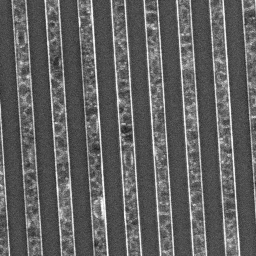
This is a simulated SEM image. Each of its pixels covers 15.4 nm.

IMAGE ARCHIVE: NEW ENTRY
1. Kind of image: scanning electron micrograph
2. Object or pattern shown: parallel lines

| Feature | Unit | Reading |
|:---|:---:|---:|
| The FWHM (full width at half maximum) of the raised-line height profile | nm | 212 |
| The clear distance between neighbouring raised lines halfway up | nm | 295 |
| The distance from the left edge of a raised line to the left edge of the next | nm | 506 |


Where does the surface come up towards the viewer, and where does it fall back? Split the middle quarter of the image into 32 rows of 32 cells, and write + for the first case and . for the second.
.....+++.....+++.....+++.....+++
.....+++.....+++.....++++....+++
.....+++.....+++.....++++....+++
.....+++.....+++.....++++....+++
.....+++.....++++....++++.....++
.....+++.....++++....++++.....++
.....+++.....++++....++++.....++
.....+++.....++++.....+++.....++
.....+++.....++++.....+++.....++
.....+++.....++++.....+++.....++
.....+++.....++++.....+++.....++
.....++++.....+++.....+++.....++
.....++++.....+++.....+++.....++
.....++++.....+++.....+++.....++
+.....+++.....+++.....+++.....++
+.....+++.....+++.....+++.....++
+.....+++.....+++.....+++.....++
+.....+++.....+++.....+++.....++
+.....+++.....+++.....+++.....++
+.....+++.....++++....++++....++
+.....+++.....++++....++++.....+
+.....+++.....++++....++++.....+
+.....+++.....++++....++++.....+
+.....+++.....++++.....+++.....+
+.....+++.....++++.....+++.....+
+.....+++.....++++.....+++.....+
+.....++++.....+++.....+++.....+
+.....++++.....+++.....+++.....+
+.....++++.....+++.....+++.....+
++....++++.....+++.....+++.....+
++.....+++.....+++.....+++.....+
++.....+++.....+++.....+++.....+